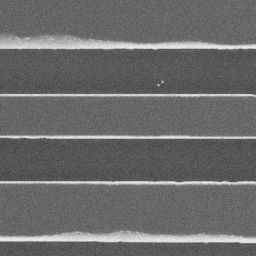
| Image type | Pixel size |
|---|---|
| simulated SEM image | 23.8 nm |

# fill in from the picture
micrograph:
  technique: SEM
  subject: lines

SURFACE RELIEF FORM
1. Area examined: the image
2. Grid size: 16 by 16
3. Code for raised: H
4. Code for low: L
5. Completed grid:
HHHHHHHHHHHHHHHH
HHHHHHHHHHHHHHHH
HHHHHHHHHHHHHHHH
LLLLLLLLLLLLLLLL
LLLLLLLLLLLLLLLL
LLLLLLLLLLLLLLLL
HHHHHHHHHHHHHHHH
HHHHHHHHHHHHHHHH
HHHHHHHHHHHHHHHH
LLLLLLLLLLLLLLLL
LLLLLLLLLLLLLLLL
HHHHHHHHHHHHHHHH
HHHHHHHHHHHHHHHH
HHHHHHHHHHHHHHHH
HHHHHHHHHHHHHHHH
LLLLLLLLLLLLLLLL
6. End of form